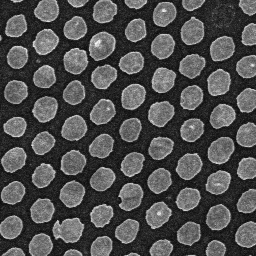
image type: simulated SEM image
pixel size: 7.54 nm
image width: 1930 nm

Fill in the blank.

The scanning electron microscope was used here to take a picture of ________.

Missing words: a regular array of raised bodies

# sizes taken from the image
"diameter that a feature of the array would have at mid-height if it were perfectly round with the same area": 181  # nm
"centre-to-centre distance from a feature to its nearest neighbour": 32.3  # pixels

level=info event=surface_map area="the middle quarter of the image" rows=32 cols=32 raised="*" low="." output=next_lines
******....*...******.........***
.****...*****.*****....***...***
.......******...*......*****..**
.......******.........******...*
..**...*****..........*****.....
.****...***.....***...*****.....
*****..........*****...***....**
*****..........*****.........***
*****..........*****..........**
.***.....***...*****.....*....**
........****...****...*****...**
.......******........******.....
.......******........*******....
.***...*****.........******.....
*****..****....****...****....**
******........*****....**.....**
******........*****..........***
*****....*....*****..........***
****....****...***.....**.....**
.......*****..........*****.....
.......*****.........******.....
......******.........******.....
****...****......**..*****......
*****....*.....*****..***....***
*****..........*****.........***
*****.........******........****
****....****..*****....***..****
***.....*****..***....****...***
.......******........******...**
.**....*****.........******.....
*****..*****...****..*****......
*****...**....*****...***.....**